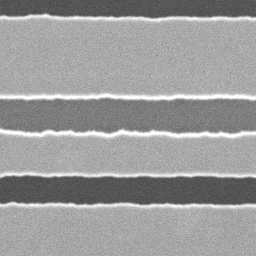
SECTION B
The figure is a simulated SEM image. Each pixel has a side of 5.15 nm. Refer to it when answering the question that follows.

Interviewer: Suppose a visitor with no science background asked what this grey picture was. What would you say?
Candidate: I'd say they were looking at lines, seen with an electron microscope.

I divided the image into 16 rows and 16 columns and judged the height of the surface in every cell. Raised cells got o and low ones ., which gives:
................
oooooooooooooooo
oooooooooooooooo
oooooooooooooooo
oooooooooooooooo
oooooooooooooooo
................
................
oooooooooooooooo
oooooooooooooooo
oooooooooooooooo
................
................
oooooooooooooooo
oooooooooooooooo
oooooooooooooooo